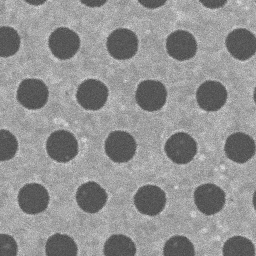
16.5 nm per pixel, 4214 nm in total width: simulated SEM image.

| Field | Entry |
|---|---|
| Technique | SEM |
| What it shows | a regular array of holes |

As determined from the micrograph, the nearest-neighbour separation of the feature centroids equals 960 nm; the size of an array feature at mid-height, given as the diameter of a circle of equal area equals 544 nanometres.